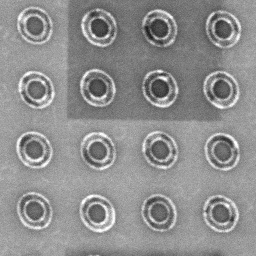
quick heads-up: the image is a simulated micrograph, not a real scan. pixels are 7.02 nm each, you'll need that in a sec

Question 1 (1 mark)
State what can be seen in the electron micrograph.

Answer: a regular array of ring-shaped raised bodies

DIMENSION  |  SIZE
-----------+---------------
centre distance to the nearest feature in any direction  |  60.5 px